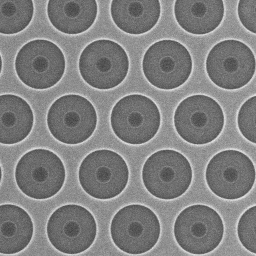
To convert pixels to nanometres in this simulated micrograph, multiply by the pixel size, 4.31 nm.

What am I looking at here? an array of small figures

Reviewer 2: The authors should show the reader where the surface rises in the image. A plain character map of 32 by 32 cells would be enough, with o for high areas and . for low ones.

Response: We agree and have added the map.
....oo......oo......oo......oo..
....oo......oo......oo......oo..
....oo......oo......oo......oo..
...oooo....oooo....oooo....oooo.
oooooooooooooooooooooooooooooooo
ooo....oooo....oooo....oooo....o
oo......oo......oo......oo......
oo......oo......oo......oo......
oo......oo......oo......oo......
oo......oo......oo......oo......
ooo....oooo....oooo....oooo....o
oooooooooooooooooooooooooooooooo
...oooo....oooo....oooo....oooo.
....oo......oo......oo......oo..
....oo......oo......oo......oo..
....oo......oo......oo......oo..
....oo......oo......oo......oo..
...oooo....oooo....oooo....oooo.
oooooooooooooooooooooooooooooooo
ooo....oooo....oooo....oooo....o
oo......oo......oo......oo......
oo......oo......oo......oo......
oo......oo......oo......oo......
oo......oo......oo.....ooo.....o
ooo....oooo...ooooo...ooooo...oo
oooooooooooooooooooooooooooooooo
...oooo....oooo....oooo....oooo.
....oo......oo......oo......oo..
....oo......oo......oo......oo..
....oo......oo......oo......oo..
....oo......oo.....ooo.....ooo..
..oooooo..oooooo..ooooo...ooooo.